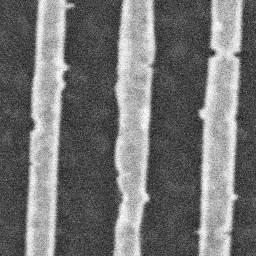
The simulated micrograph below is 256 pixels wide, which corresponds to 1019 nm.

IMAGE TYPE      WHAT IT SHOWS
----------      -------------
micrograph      one or a few lines or trenches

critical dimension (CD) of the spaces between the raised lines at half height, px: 61.6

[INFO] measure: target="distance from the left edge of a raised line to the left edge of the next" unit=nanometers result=347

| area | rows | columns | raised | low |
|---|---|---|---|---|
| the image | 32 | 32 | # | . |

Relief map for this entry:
.....###........###........###..
.....###.......####........###..
.....###.......####........###..
.....###.......####........###..
.....###.......####........###..
.....###.......####........###..
.....###.......####........##...
.....###.......####........###..
.....###.......####.......####..
.....##........####.......####..
.....###.......####.......###...
....###........####.......###...
....###........####.......###...
....###........####.......###...
....###........###........###...
.....##........###........###...
....###........###........###...
....###........###........###...
....###........###........###...
....###........###........###...
....###........###........###...
....###........###........###...
....###........###........###...
....###........###........###...
....###........###........###...
....###........###........###...
....###........##........####...
....###........##........####...
....###........##........####...
....##.........##........###....
....##.........##........###....
....##........###........###....